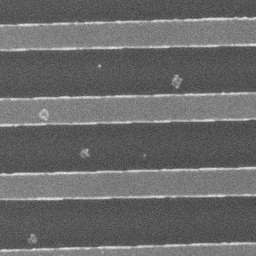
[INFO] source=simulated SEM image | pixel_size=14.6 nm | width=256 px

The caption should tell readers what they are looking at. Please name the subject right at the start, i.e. lines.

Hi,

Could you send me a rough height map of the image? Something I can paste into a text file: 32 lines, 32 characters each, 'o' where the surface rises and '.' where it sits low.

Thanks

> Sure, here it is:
................................
................................
.....................ooooooooooo
oooooooooooooooooooooooooooooooo
oooooooooooooooooooooooooooooooo
oooooooooooooooooooooooooooooooo
................................
................................
................................
................................
................................
................................
oooooooooooooooooooooooooooooooo
oooooooooooooooooooooooooooooooo
oooooooooooooooooooooooooooooooo
oooooo..........................
................................
................................
................................
................................
................................
............oooooooooooooooooooo
oooooooooooooooooooooooooooooooo
oooooooooooooooooooooooooooooooo
oooooooooooooooooooooooooooo....
................................
................................
................................
................................
................................
...........................ooooo
oooooooooooooooooooooooooooooooo